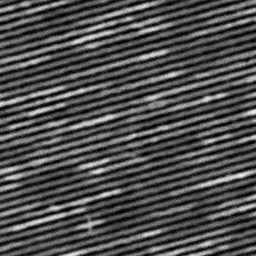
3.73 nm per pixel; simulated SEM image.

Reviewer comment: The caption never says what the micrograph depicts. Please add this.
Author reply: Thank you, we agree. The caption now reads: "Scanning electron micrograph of parallel lines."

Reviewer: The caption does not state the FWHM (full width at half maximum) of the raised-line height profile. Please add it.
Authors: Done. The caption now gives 14.4 nanometers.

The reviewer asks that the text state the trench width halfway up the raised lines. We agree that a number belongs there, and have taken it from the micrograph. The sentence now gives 0.0171 microns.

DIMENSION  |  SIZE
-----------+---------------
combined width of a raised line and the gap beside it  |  0.0306 microns